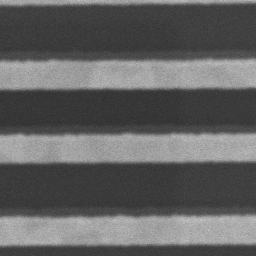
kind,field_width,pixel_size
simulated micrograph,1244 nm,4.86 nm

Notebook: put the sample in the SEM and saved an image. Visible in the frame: lines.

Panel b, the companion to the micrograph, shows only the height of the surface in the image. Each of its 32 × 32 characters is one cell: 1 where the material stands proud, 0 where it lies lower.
11111111000000000000000000000000
00000000000000000000000000000000
00000000000000000000000000000000
00000000000000000000000000000000
00000000000000000000000000000000
00000000000000000000000000000000
00000000000000000000000000000000
00000010000000000000000011101111
11111111111111111111111111111111
11111111111111111111111111111111
11111111111111111111111111111111
00000000000000000000000000000000
00000000000000000000000000000000
00000000000000000000000000000000
00000000000000000000000000000000
00000000000000000000000000000000
00000000000000000000000000000000
11111111111111111111111111111111
11111111111111111111111111111111
11111111111111111111111111111111
00000000000000000000000000000000
00000000000000000000000000000000
00000000000000000000000000000000
00000000000000000000000000000000
00000000000000000000000000000000
00000000000000000000000000000000
00000000000000000000000000000000
11111111111111111111111111111111
11111111111111111111111111111111
11111111111111111111111111111111
11111111111111111111101100000000
00000000000000000000000000000000